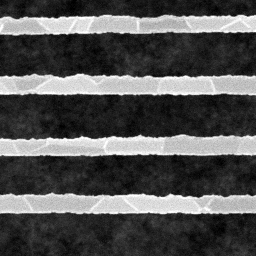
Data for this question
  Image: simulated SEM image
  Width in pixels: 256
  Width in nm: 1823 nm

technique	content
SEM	lines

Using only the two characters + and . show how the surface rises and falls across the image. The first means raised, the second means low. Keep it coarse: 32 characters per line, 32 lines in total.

................................
................................
++++++++++++++++++++++++++++++++
++++++++++++++++++++++++++++++++
................................
................................
................................
................................
................................
....++...++.................+...
++++++++++++++++++++++++++++++++
++++++++++++++++++++++++++++++++
................................
................................
................................
................................
................................
+++.++++++++++++++++++++++++++++
++++++++++++++++++++++++++++++++
................................
................................
................................
................................
................................
+++++++++++.+++++++..++...++.+++
++++++++++++++++++++++++++++++++
++++++++.+++++++++++++++++++++++
................................
................................
................................
................................
................................